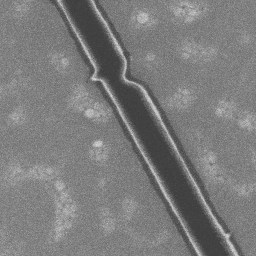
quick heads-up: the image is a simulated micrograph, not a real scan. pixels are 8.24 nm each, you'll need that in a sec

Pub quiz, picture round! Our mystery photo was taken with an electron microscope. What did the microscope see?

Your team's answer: one or a few lines or trenches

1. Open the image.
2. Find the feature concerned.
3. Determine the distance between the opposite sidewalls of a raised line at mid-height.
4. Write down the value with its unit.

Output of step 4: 264 nm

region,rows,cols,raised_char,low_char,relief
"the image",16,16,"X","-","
----XX----------
----XXX---------
-----XX---------
------XX--------
------XX--------
-------XX-------
-------XXX------
--------XX------
--------XXX-----
---------XX-----
---------XXX----
----------XX----
----------XXX---
-----------XX---
------------XX--
------------XXX-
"